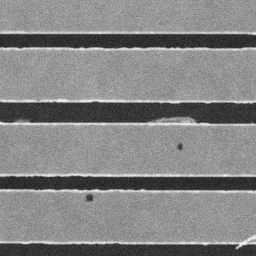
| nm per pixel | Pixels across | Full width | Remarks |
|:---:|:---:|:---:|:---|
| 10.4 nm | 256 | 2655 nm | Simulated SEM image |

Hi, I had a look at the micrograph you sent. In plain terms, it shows lines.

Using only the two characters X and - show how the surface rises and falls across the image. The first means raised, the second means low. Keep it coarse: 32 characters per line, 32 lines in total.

XXXXXXXXXXXXXXXXXXXXXXXXXXXXXXXX
XXXXXXXXXXXXXXXXXXXXXXXXXXXXXXXX
XXXXXXXXXXXXXXXXXXXXXXXXXXXXXXXX
XXXXXXXXXXXXXXXXXXXXXXXXXXXXXXXX
--------------------------------
--------------------------------
XXXXXXXXXXXXXXXXXXXXXXXXXXXXXXXX
XXXXXXXXXXXXXXXXXXXXXXXXXXXXXXXX
XXXXXXXXXXXXXXXXXXXXXXXXXXXXXXXX
XXXXXXXXXXXXXXXXXXXXXXXXXXXXXXXX
XXXXXXXXXXXXXXXXXXXXXXXXXXXXXXXX
XXXXXXXXXXXXXXXXXXXXXXXXXXXXXXXX
XXXXXXXXXXXXXXXXXXXXXXXXXXXXXXXX
--------------------------------
--------------------------------
XXXXXXXXXXXXXXXXXXXXXXXXXX------
XXXXXXXXXXXXXXXXXXXXXXXXXXXXXXXX
XXXXXXXXXXXXXXXXXXXXXXXXXXXXXXXX
XXXXXXXXXXXXXXXXXXXXXXXXXXXXXXXX
XXXXXXXXXXXXXXXXXXXXXXXXXXXXXXXX
XXXXXXXXXXXXXXXXXXXXXXXXXXXXXXXX
XXXXXXXXXXXXXXXXXXXXXXXXXXXXXXXX
--------------------------------
--------------------------------
XXXXXXXXXXXXXXXXXXXXXXXXXXXXXXXX
XXXXXXXXXXXXXXXXXXXXXXXXXXXXXXXX
XXXXXXXXXXXXXXXXXXXXXXXXXXXXXXXX
XXXXXXXXXXXXXXXXXXXXXXXXXXXXXXXX
XXXXXXXXXXXXXXXXXXXXXXXXXXXXXXXX
XXXXXXXXXXXXXXXXXXXXXXXXXXXXXXXX
-------------------------X---XX-
--------------------------------